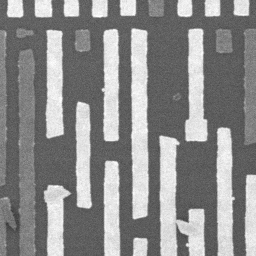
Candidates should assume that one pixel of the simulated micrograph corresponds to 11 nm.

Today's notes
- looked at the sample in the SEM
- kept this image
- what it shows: wiring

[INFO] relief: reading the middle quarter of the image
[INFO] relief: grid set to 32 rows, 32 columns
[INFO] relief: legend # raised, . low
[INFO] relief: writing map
..........###....####..........#
..........###....####..........#
..........###....####..........#
..........###....####..........#
..........###....####..........#
..........###....####..........#
..........###....####..........#
..........###....####..........#
..........###....####.......#...
..........###....####...........
...###....###....####...........
...###....###....####...........
...###....###....####...........
...###....###....####...........
...###....###....####..........#
...###....###....####..........#
...###....###....####..........#
...###....###....####..........#
...###....###....####...###....#
...###...........####...####....
...###...........####...####....
...###...........####...####....
...###...........####...####....
...###...........####...####....
...###.....#.....####...####....
...###.....##.....###...####....
...###....###.....###...####....
...###....###....####...####....
...###....###....####...####....
...###....###....####...####....
...###....###....####...####....
...###....###....####...####....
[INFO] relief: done